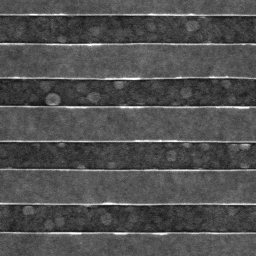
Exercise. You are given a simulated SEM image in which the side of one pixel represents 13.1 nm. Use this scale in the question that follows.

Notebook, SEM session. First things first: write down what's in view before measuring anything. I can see one or a few lines or trenches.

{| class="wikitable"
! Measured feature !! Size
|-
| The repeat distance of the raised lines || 826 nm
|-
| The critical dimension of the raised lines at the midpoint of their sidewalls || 457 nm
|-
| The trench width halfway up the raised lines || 368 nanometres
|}